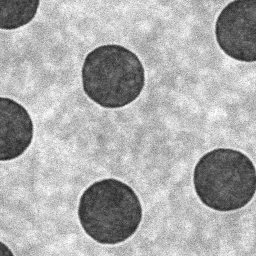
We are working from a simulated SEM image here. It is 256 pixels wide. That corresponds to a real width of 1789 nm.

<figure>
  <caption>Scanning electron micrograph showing holes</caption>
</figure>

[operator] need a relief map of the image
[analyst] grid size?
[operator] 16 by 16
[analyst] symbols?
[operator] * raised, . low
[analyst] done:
..************..
..************..
**************..
*****...******..
*****....*******
*****....*******
.*****..********
..**************
..**************
.************..*
************....
******..****....
*****....****...
*****....*******
*****...********
****************